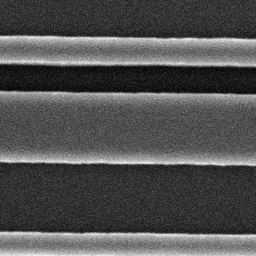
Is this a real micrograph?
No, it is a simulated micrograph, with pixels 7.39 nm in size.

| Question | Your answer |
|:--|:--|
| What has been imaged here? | lines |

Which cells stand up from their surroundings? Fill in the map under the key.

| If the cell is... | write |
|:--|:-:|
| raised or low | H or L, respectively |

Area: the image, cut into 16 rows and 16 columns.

LLLLLLLLLLLLLLLL
LLLLLLLLLLLLLLLL
HHHHHHHHHHHHHHHL
HHHHHHHHHHHHHHHH
LLLLLLLLLLLLLLLL
LLLLLLLLLLLLLLLL
HHHHHHHHHHHHHHHH
HHHHHHHHHHHHHHHH
HHHHHHHHHHHHHHHH
HHHHHHHHHHHHHHHH
LLLLLLLLLLLLLLLL
LLLLLLLLLLLLLLLL
LLLLLLLLLLLLLLLL
LLLLLLLLLLLLLLLL
LLLLLLLLLLLLLLLL
HHHHHHHHHHHHHHHH